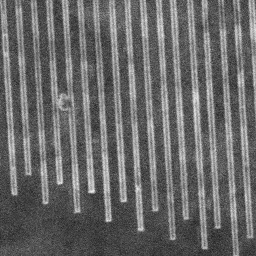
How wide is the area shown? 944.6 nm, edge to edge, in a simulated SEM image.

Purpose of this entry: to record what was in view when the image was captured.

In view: parallel lines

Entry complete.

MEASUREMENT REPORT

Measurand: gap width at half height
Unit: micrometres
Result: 0.0391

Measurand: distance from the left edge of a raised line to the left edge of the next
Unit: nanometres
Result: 57.2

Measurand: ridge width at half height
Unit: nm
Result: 17.5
